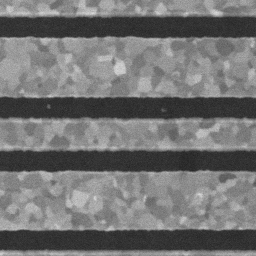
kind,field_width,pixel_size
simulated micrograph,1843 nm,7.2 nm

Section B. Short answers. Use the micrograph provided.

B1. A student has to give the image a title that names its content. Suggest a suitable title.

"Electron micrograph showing lines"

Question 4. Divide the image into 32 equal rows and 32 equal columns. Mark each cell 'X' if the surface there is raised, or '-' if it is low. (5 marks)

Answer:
XXXXXXXXXXXXXXXXXXXXXXXXXXXXXXXX
XXXXXXXXXXXXXXXXXXXXXXXXXXXXXXXX
--------------------------------
--------------------------------
--------------------------------
XXXXXXXXXXXXXXXXXXXXXXXXXXXXXXXX
XXXXXXXXXXXXXXXXXXXXXXXXXXXXXXXX
XXXXXXXXXXXXXXXXXXXXXXXXXXXXXXXX
XXXXXXXXXXXXXXXXXXXXXXXXXXXXXXXX
XXXXXXXXXXXXXXXXXXXXXXXXXXXXXXXX
XXXXXXXXXXXXXXXXXXXXXXXXXXXXXXXX
XXXXXXXXXXXXXXXXXXXXXXXXXXXXXXXX
--------------------------------
--------------------------------
--------------------------------
XXXXXXXXXXXXXXXXXXXXXXXXXXXXXXXX
XXXXXXXXXXXXXXXXXXXXXXXXXXXXXXXX
XXXXXXXXXXXXXXXXXXXXXXXXXXXXXXXX
XXXXXXXXXXXXXXXXXXXXXXXXXXXXXXXX
--------------------------------
--------------------------------
---XXX--XXX-----------X--XX---X-
XXXXXXXXXXXXXXXXXXXXXXXXXXXXXXXX
XXXXXXXXXXXXXXXXXXXXXXXXXXXXXXXX
XXXXXXXXXXXXXXXXXXXXXXXXXXXXXXXX
XXXXXXXXXXXXXXXXXXXXXXXXXXXXXXXX
XXXXXXXXXXXXXXXXXXXXXXXXXXXXXXXX
XXXXXXXXXXXXXXXXXXXXXXXXXXXXXXXX
XXXXXXXXXXXXXXXXXXXXXXXXXXXXXXXX
--------------------------------
--------------------------------
X--X-X--XX------X----XX-XX------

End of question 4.